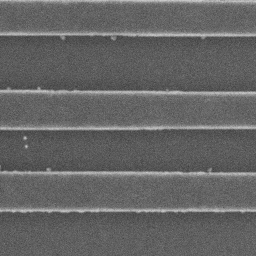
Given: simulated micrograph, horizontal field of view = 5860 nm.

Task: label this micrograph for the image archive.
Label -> lines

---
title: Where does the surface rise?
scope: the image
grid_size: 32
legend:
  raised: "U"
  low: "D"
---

UUUUUUUUUUUUUUUUUUUUUUUUUUUUUUUU
UUUUUUUUUUUUUUUUUUUUUUUUUUUUUUUU
UUUUUUUUUUUUUUUUUUUUUUUUUUUUUUUU
UUUUUUUUUUUUUUUUUUUUUUUUUUUUUUUU
DDDDDDDDDDDDDDDDDDDDDDDDDDDDDDDD
DDDDDDDDDDDDDDDDDDDDDDDDDDDDDDDD
DDDDDDDDDDDDDDDDDDDDDDDDDDDDDDDD
DDDDDDDDDDDDDDDDDDDDDDDDDDDDDDDD
DDDDDDDDDDDDDDDDDDDDDDDDDDDDDDDD
DDDDDDDDDDDDDDDDDDDDDDDDDDDDDDDD
DDDDDDDDDDDDDDDDDDDDDDDDDDDDDDDD
UUUUUUUUUUUUUUUUUUUDDDDDDDDDDDDD
UUUUUUUUUUUUUUUUUUUUUUUUUUUUUUUU
UUUUUUUUUUUUUUUUUUUUUUUUUUUUUUUU
UUUUUUUUUUUUUUUUUUUUUUUUUUUUUUUU
UUUUUUUUUUUUUUUUUUUUUUUUUUUUUUUU
DDDDDDDDDDDDDDDDDDDDDDDDDDDDDDDD
DDDDDDDDDDDDDDDDDDDDDDDDDDDDDDDD
DDDDDDDDDDDDDDDDDDDDDDDDDDDDDDDD
DDDDDDDDDDDDDDDDDDDDDDDDDDDDDDDD
DDDDDDDDDDDDDDDDDDDDDDDDDDDDDDDD
DDDDDDDDDDDDDDDDDDDDDDDDDDDDDDDD
UUUUUUUUUUUUUUUUUUUUUUUUUUUUUUUU
UUUUUUUUUUUUUUUUUUUUUUUUUUUUUUUU
UUUUUUUUUUUUUUUUUUUUUUUUUUUUUUUU
UUUUUUUUUUUUUUUUUUUUUUUUUUUUUUUU
DDDDDDDDDDDDDDDDDDDDDDDDDDDDDDDD
DDDDDDDDDDDDDDDDDDDDDDDDDDDDDDDD
DDDDDDDDDDDDDDDDDDDDDDDDDDDDDDDD
DDDDDDDDDDDDDDDDDDDDDDDDDDDDDDDD
DDDDDDDDDDDDDDDDDDDDDDDDDDDDDDDD
DDDDDDDDDDDDDDDDDDDDDDDDDDDDDDDD